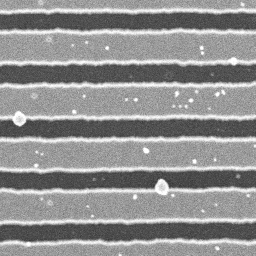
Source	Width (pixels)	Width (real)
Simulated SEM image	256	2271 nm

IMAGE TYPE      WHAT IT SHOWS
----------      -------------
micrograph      lines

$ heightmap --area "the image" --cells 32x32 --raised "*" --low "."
********************************
**********************..********
................................
................................
********************************
********************************
********************************
********************************
................................
................................
*....*******.****************.**
********************************
********************************
********************************
********************************
..*.............................
................................
********************************
********************************
********************************
********************************
.....*..........................
................................
...................**...........
********************************
********************************
********************************
********************************
................................
................................
********************************
********************************